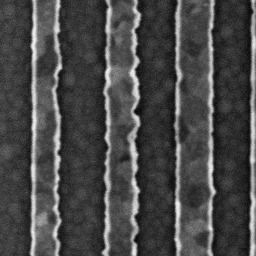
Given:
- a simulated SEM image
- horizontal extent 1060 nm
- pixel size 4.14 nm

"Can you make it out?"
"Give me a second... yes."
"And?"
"one or a few lines or trenches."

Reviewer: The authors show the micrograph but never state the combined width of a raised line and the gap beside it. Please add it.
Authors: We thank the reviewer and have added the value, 309 nanometres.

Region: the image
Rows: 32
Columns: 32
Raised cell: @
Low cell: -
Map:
----@@@-------@@@-----@@@@@-----
----@@@-------@@@-----@@@@@-----
----@@@-------@@@-----@@@@@-----
----@@@------@@@@-----@@@@------
----@@@------@@@@-----@@@@------
----@@@------@@@@-----@@@@------
----@@@------@@@@-----@@@@------
----@@@@-----@@@@-----@@@@@-----
----@@@------@@@@-----@@@@@-----
----@@@------@@@@-----@@@@------
----@@@------@@@@-----@@@@------
----@@@------@@@@-----@@@@------
----@@@------@@@@-----@@@@------
----@@@------@@@@-----@@@@------
----@@@-------@@@-----@@@@------
----@@@------@@@@-----@@@@------
----@@@------@@@@-----@@@@------
----@@@------@@@@-----@@@@------
----@@@-------@@@-----@@@@------
----@@@-------@@@-----@@@@------
----@@@------@@@@-----@@@@------
----@@@------@@@@-----@@@@------
----@@@------@@@@-----@@@@------
----@@@-------@@@-----@@@@@-----
----@@@------@@@@-----@@@@@-----
----@@@------@@@@-----@@@@------
----@@@------@@@@-----@@@@-----@
----@@@------@@@@-----@@@@-----@
----@@@------@@@@-----@@@@-----@
----@@@------@@@@-----@@@@------
----@@@------@@@@-----@@@@------
----@@@------@@@@-----@@@@-----@